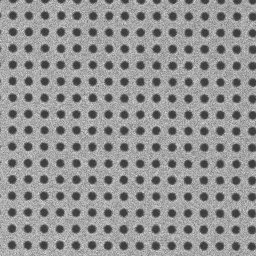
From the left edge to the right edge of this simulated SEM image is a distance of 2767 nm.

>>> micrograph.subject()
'a regular array of holes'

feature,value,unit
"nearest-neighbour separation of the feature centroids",0.171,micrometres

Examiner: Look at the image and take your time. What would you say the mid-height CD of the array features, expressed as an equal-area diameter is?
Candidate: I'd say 97.6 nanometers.